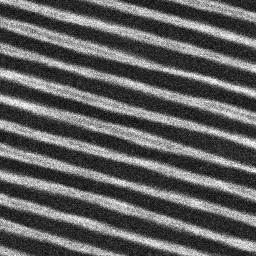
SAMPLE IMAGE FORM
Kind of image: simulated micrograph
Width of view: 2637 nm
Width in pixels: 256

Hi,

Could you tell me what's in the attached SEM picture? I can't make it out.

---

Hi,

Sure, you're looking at parallel lines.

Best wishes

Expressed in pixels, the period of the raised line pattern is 24.4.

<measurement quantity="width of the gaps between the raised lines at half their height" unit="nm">160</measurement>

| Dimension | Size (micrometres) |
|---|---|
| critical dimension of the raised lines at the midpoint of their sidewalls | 0.0855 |